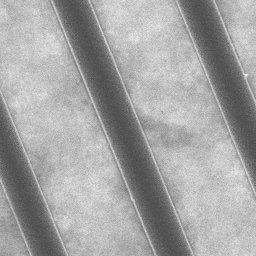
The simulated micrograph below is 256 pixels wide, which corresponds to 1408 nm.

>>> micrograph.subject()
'one or a few lines or trenches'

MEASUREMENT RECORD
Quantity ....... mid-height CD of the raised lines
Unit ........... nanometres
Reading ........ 199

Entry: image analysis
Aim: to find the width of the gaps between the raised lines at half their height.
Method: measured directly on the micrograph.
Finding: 441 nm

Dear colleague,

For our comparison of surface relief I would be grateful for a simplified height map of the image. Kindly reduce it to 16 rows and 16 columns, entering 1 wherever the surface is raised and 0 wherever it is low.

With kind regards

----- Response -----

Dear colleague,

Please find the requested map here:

0001110000011100
0000110000001100
0000111000001100
0000011000001110
0000011000000110
0000011100000111
0000001100000011
1000001110000011
1000000110000011
1100000110000001
1100000111000001
1100000011000000
0110000011100000
0110000001100000
0111000001110000
0011000001110000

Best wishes